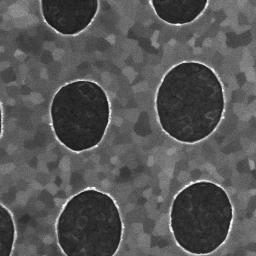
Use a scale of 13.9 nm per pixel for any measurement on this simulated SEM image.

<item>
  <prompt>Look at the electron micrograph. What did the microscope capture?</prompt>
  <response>holes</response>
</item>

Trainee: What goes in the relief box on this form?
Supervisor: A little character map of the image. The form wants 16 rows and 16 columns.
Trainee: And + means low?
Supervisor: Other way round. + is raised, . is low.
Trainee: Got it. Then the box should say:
+++...++++...+++
+++...++++++++++
++++++++++++++++
++++++++++++++++
+++++++++++..+++
++++..++++....++
+++....+++....++
+++....+++....++
++++..+++++..+++
++++++++++++++++
++++++++++++++++
++++++++++++.+++
++++...++++...++
.+++...++++...++
.+++....+++...++
.+++...+++++..++